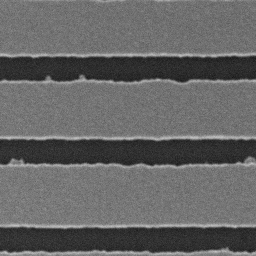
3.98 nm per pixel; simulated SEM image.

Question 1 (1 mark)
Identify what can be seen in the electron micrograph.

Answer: lines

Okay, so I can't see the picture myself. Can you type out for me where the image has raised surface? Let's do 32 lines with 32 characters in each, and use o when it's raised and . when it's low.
oooooooooooooooooooooooooooooooo
oooooooooooooooooooooooooooooooo
oooooooooooooooooooooooooooooooo
oooooooooooooooooooooooooooooooo
oooooooooooooooooooooooooooooooo
oooooooooooooooooooooooooooooooo
oooooooooooooooooooooooooooooooo
................................
................................
................................
oooooooooooooooooooooooooooooooo
oooooooooooooooooooooooooooooooo
oooooooooooooooooooooooooooooooo
oooooooooooooooooooooooooooooooo
oooooooooooooooooooooooooooooooo
oooooooooooooooooooooooooooooooo
oooooooooooooooooooooooooooooooo
...................o............
................................
................................
.....o......o................ooo
oooooooooooooooooooooooooooooooo
oooooooooooooooooooooooooooooooo
oooooooooooooooooooooooooooooooo
oooooooooooooooooooooooooooooooo
oooooooooooooooooooooooooooooooo
oooooooooooooooooooooooooooooooo
oooooooooooooooooooooooooooooooo
................................
................................
................................
o..ooo...o.oooooo.o......oooo...